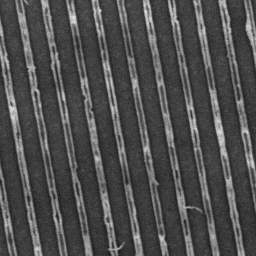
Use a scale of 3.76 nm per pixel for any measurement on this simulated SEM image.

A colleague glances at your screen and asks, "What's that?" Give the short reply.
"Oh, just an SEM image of parallel lines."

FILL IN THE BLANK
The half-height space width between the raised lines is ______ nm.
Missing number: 74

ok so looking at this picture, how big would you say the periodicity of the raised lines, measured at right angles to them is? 93.8 nm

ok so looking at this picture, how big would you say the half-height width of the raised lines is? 20.3 nanometres